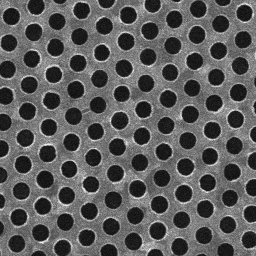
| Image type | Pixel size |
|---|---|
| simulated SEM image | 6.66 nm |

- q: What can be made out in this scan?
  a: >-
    a regular array of holes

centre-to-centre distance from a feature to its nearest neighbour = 26.1 pixels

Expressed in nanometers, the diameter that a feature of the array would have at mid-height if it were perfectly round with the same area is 117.